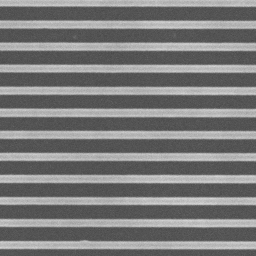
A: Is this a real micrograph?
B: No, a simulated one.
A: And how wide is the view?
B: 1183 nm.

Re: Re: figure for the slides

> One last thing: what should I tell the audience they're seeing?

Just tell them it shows parallel lines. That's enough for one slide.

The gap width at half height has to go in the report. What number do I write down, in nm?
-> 67.6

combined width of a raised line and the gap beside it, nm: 102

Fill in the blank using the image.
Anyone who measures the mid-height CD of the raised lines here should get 35.8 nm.